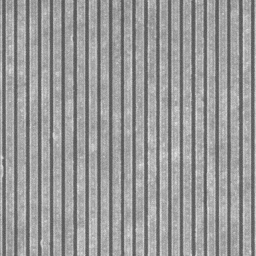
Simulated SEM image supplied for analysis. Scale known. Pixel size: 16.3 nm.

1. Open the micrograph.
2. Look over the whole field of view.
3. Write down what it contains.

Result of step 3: parallel lines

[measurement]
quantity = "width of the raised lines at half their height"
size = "120 nanometres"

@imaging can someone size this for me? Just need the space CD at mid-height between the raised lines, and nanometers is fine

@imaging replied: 75.2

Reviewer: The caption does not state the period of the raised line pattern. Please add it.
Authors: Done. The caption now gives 193 nm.